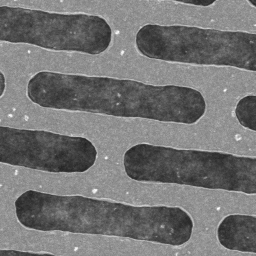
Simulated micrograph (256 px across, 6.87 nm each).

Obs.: holes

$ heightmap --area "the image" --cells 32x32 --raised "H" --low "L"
HHHHHHHHHHHHHHHHHHHHHHHHLLHHHHHL
LLLLLLHHHHHHHHHHHHHHHHHHHHHHHHHH
LLLLLLLLLLLLLHHHHHHHHHHHHHHHHHHH
LLLLLLLLLLLLLLHHHHLLLLLLLHHHHHHH
LLLLLLLLLLLLLLHHHLLLLLLLLLLLLLLL
HHHHLLLLLLLLLLHHHLLLLLLLLLLLLLLL
HHHHHHHHHHLLLHHHHLLLLLLLLLLLLLLL
HHHHHHHHHHHHHHHHHHHHLLLLLLLLLLLL
HHHHHHHHHHHHHHHHHHHHHHHHHHHHHHLL
HHHHLLLLLLHHHHHHHHHHHHHHHHHHHHHH
LHHHLLLLLLLLLLLLLLHHHHHHHHHHHHHH
HHHLLLLLLLLLLLLLLLLLLLLLLHHHHHHH
HHHHLLLLLLLLLLLLLLLLLLLLLLHHHHLL
HHHHHHLLLLLLLLLLLLLLLLLLLLHHHHLL
HHHHHHHHHHHHHHLLLLLLLLLLLHHHHHLL
HHHHHHHHHHHHHHHHHHHHHHHLHHHHHHLL
LLLLLLHHHHHHHHHHHHHHHHHHHHHHHHHH
LLLLLLLLLLLHHHHHHHHHHHHHHHHHHHHH
LLLLLLLLLLLLHHHHLLLLLHHHHHHHHHHH
LLLLLLLLLLLLHHHHLLLLLLLLLLLLLLHH
HLLLLLLLLLLLHHHHLLLLLLLLLLLLLLLL
HHHHHHLLLLHHHHHHLLLLLLLLLLLLLLLL
HHHHHHHHHHHHHHHHHLLLLLLLLLLLLLLL
HHHHHHHHHHHHHHHHHHHHHHHHHHLLLLLL
HHHLLLLLHLHHHHHHHHHHHHHHHHHHHHHH
HHLLLLLLLLLLLLLHHHHHHHHHHHHHHHHH
HHLLLLLLLLLLLLLLLLLLLLLHHHHHHHHH
HHLLLLLLLLLLLLLLLLLLLLLLHHHHLLLL
HHHHLLLLLLLLLLLLLLLLLLLLHHHLLLLL
HHHHHHHHHHHHHHHLLLLLLLLLHHHLLLLL
HHHHHHHHHHHHHHHHHHHHHLLHHHHHLLLL
LLLLHHHHHHHHHHHHHHHHHHHHHHHHHHHL